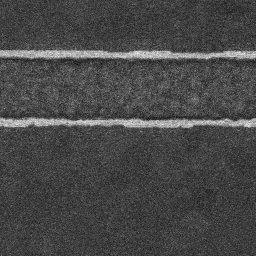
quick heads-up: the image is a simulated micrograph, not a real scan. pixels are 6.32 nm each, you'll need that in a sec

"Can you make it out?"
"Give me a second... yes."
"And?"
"one or a few lines or trenches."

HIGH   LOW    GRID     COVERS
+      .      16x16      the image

++++++++++++++++
++++++++++++++++
++++++++++++++++
........+++++..+
................
................
................
................
++++++++++++++++
++++++++++++++++
++++++++++++++++
++++++++++++++++
++++++++++++++++
++++++++++++++++
++++++++++++++++
++++++++++++++++